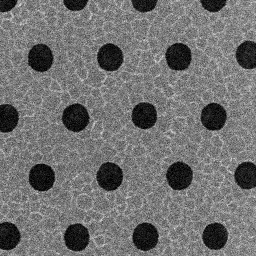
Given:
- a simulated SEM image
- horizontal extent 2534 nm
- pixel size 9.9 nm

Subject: a regular array of holes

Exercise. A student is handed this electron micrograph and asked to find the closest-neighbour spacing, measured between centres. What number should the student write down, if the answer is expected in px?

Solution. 68.4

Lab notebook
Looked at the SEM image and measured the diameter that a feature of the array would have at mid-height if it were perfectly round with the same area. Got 278 nm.